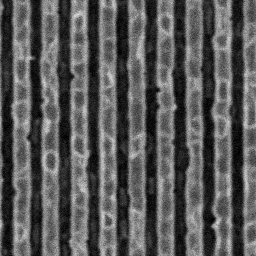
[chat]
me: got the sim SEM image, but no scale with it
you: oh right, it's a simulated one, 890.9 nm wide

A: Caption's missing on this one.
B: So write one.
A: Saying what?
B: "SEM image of parallel lines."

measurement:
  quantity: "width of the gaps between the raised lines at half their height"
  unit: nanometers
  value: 46.1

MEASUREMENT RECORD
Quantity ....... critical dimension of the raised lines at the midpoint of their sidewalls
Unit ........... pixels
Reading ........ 16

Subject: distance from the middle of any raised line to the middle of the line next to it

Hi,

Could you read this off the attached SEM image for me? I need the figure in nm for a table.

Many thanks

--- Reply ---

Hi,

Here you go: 99.9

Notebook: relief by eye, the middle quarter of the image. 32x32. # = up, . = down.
..####...####...####...####....#
..####...####...####...####....#
..####...####...####...####....#
...###...####...####...####....#
..####...####...####...####....#
..####...####...####...####....#
..####...####...####....###....#
..####...####...####...####....#
..####...####...####...####....#
..####...####...####....###....#
..####...####...####....####...#
..####...####...####....####...#
..####...####...####...####....#
..####...####...####...####....#
..####...####....###...####....#
..####...####....###...####....#
..####...####...####...####....#
..####...####...####...####....#
..####...####....###...####....#
..####...####...####....###....#
..####...####...####....###....#
..####...####...####....###.....
..####...####...####....###.....
..####...####...####....###.....
..####...####...####....###.....
..####...####...####....###.....
..###....####...####....###....#
..####...####...####....####...#
..####...####...####....####...#
..####...####...####....###....#
..####...####...####...####....#
..####...####...####....###....#